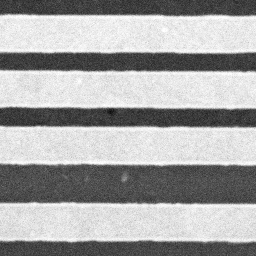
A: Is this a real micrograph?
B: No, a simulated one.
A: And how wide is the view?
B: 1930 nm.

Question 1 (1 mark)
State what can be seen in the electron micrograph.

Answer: lines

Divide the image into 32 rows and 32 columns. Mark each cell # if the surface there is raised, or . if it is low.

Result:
................................
................................
################################
################################
################################
################################
............##........########..
................................
................................
################################
################################
################################
################################
............................#...
................................
................................
################################
################################
################################
################################
...................##.......#.##
................................
................................
................................
................................
....#...........................
################################
################################
################################
################################
................................
................................